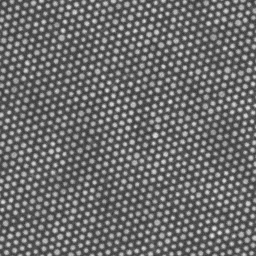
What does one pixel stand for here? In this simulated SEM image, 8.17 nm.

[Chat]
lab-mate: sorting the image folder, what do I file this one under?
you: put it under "a regular array of raised bodies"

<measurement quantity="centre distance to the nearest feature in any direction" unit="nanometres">61.8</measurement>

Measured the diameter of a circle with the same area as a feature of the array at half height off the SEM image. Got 3.9 pixels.